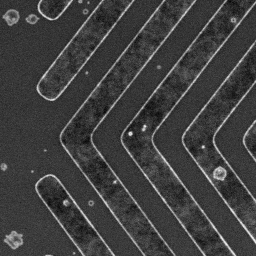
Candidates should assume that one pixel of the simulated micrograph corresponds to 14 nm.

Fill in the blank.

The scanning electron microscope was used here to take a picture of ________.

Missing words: groups of lines, slits or small figures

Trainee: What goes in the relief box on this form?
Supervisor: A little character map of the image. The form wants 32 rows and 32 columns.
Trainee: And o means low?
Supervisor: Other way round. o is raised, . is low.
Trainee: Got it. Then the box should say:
.....oooo...oooo....oooo....oooo
.o...ooo....oooo...oooo....oooo.
.o.........oooo....oooo...oooo..
..........oooo....oooo....ooo...
.........oooo....oooo....oooo...
.........oooo...oooo....oooo....
........oooo...oooo....oooo....o
.......oooo....oooo...oooo....oo
......oooo....oooo....oooo...ooo
.....oooo....oooo....oooo....ooo
.....oooo...oooo....oooo....oooo
.....ooo....ooo....oooo....oooo.
......o....oooo....ooo....oooo..
..........oooo....oooo...oooo...
.........oooo....oooo....oooo...
........oooo....oooo....oooo....
........oooo...oooo....oooo....o
........oooo...oooo....oooo...oo
........oooo....oooo...oooo....o
.........oooo...oooo....oooo...o
..........ooo....oooo....oooo...
..........oooo....oooo...oooo...
.....oo....oooo....ooo....oooo..
.....ooo....oooo...oooo....oooo.
.....oooo....ooo....oooo....ooo.
......ooo....oooo....oooo...oooo
......oooo....oooo....ooo....ooo
.......oooo....oooo...oooo....oo
........oooo...oooo....oooo....o
.o.......ooo....oooo....oooo...o
.o.......oooo....oooo....ooo....
..........oooo....oooo...oooo...